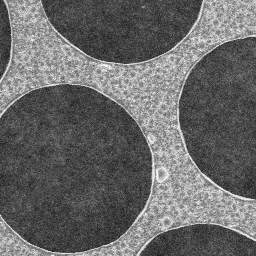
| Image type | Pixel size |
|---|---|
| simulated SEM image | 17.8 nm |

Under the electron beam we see holes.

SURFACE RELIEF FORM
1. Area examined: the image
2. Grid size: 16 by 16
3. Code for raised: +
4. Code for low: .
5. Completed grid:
+++..........+++
.++.........++++
.+++.......++++.
.+++++....+++...
++++++++++++....
+++...+++++.....
+......++++.....
........+++.....
.........++.....
.........+++....
..........++....
.........+++++..
.........+++++++
.........+++++++
+.......++.....+
+++...+++.......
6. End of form